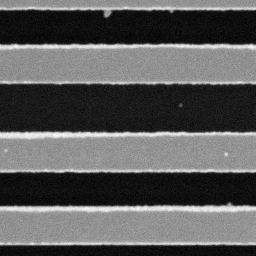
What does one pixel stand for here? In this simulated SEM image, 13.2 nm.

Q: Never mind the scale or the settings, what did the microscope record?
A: lines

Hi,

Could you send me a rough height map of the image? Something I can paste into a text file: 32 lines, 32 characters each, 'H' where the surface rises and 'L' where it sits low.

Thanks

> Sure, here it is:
HHHHHHHHHHHHHHHHHHHHHHHHHHHHHHHH
LLLLLLLLLLLLLLLLLLLLLLLLLLLLLLLL
LLLLLLLLLLLLLLLLLLLLLLLLLLLLLLLL
LLLLLLLLLLLLLLLLLLLLLLLLLLLLLLLL
LLLLLLLLLLLLLLLLLLLLLLLLLLLLLLLL
LLLLLLLLLLLLLLLLLLLLLLLLLLLLLLLL
HHHHHHHHHHHHHHHHHHHHHHHHHHHHHHHH
HHHHHHHHHHHHHHHHHHHHHHHHHHHHHHHH
HHHHHHHHHHHHHHHHHHHHHHHHHHHHHHHH
HHHHHHHHHHHHHHHHHHHHHHHHHHHHHHHH
LLLLLLLLLLLLLLLLLLLLLLLLLLLLLLLL
LLLLLLLLLLLLLLLLLLLLLLLLLLLLLLLL
LLLLLLLLLLLLLLLLLLLLLLLLLLLLLLLL
LLLLLLLLLLLLLLLLLLLLLLLLLLLLLLLL
LLLLLLLLLLLLLLLLLLLLLLLLLLLLLLLL
LLLLLLLLLLLLLLLLLLLLLLLLLLLLLLLL
LLLLLLLLLLLLLLLLLLLLLLLLLLLLLLLL
HHHHHHHHHHHHHHHHHHHHHHHHHHHHHHHH
HHHHHHHHHHHHHHHHHHHHHHHHHHHHHHHH
HHHHHHHHHHHHHHHHHHHHHHHHHHHHHHHH
HHHHHHHHHHHHHHHHHHHHHHHHHHHHHHHH
LLLLLLLLLLLLLLLLLLLLLLLLLLLLLLLL
LLLLLLLLLLLLLLLLLLLLLLLLLLLLLLLL
LLLLLLLLLLLLLLLLLLLLLLLLLLLLLLLL
LLLLLLLLLLLLLLLLLLLLLLLLLLLLLLLL
LLLLLLLLLLLLLLLLLLLLLLLLLLLLLLLL
HHHHHHHHHHHHHHHHHHHHHHHHHHHHHHHH
HHHHHHHHHHHHHHHHHHHHHHHHHHHHHHHH
HHHHHHHHHHHHHHHHHHHHHHHHHHHHHHHH
HHHHHHHHHHHHHHHHHHHHHHHHHHHHHHHH
HHHHHHHHHHHHHHHHHHHHHHHHHHHHHHHH
LLLLLLLLLLLLLLLLLLLLLLLLLLLLLLLL